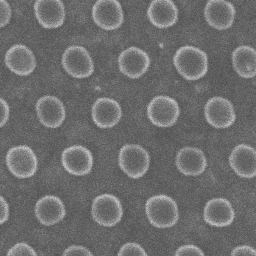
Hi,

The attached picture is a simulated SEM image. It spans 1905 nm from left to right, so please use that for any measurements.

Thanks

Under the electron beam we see a regular array of raised bodies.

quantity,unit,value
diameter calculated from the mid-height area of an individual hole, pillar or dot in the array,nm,218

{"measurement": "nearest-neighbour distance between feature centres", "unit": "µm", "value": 0.416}